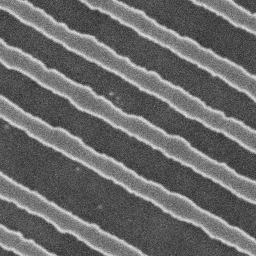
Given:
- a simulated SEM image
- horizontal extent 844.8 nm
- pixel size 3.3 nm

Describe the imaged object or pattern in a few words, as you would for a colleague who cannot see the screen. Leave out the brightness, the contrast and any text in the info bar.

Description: lines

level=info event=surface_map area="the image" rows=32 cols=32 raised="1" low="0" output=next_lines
11110000000111100000000001111000
01111000000001111100000000011110
00111110000000011110000000000111
00001111000000001111000000000011
00000011111000000011110000000000
10000000111110000000111110000000
11100000011111000000001111000000
11111000000111110000000011111000
01111100000001111100000001111100
00001111000000011111000000011111
00000111110000000111100000000111
00000001111100000011111000000001
10000000011110000000111110000000
11000000001111100000001111000000
11110000000011111000000111110000
01111100000000111110000001111100
00011111000000001111000000001111
00000111110000000111111000000111
00000001111000000001111100000001
00000000111110000000011111000000
00000000001111100000000111110000
00000000000011110000000001111000
10000000000000111100000000011110
11100000000000001111100000000111
11111000000000000011111000000011
00111110000000000001111100000000
00001111100000000000011111000000
00000011110000000000000111110000
10000001111100000000000001111100
11100000011111000000000000111110
11111000000111110000000000000111
00111100000001111000000000000011